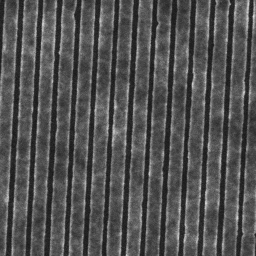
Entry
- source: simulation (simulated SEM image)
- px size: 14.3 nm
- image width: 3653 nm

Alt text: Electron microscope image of parallel lines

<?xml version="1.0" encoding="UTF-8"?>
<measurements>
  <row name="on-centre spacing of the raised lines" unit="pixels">19.2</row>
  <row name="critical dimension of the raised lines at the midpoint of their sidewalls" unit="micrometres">0.198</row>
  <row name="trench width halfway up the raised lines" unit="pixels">5.62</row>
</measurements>